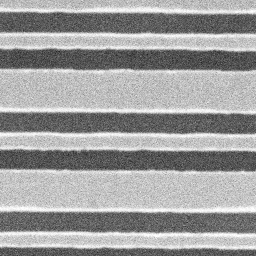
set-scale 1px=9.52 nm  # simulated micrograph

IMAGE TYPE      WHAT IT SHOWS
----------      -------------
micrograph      lines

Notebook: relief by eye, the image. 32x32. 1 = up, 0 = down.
11111111111111111111111111111111
00000000111001111011111111111111
00000000000000000000000000000000
00000000000000000000000000000000
11111111111111111111111111111111
11111111111111111111111111111111
00000000000000000000000000000000
00000000000000000000000000000000
00000000000000000000000000000000
11111111111111111111111111111111
11111111111111111111111111111111
11111111111111111111111111111111
11111111111111111111111111111111
11111111111111111111111111111111
00000000000000000000000000000000
00000000000000000000000000000000
00000000000000000000000000000000
11111111111111111111111111111111
11111111111111111111111111111111
00000000000000000000000000000000
00000000000000000000000000000000
11111111111111111111111110000010
11111111111111111111111111111111
11111111111111111111111111111111
11111111111111111111111111111111
11111111111111111111111111111111
00000000000000000000000000000000
00000000000000000000000000000000
00000000000000000000000000000000
11111111111111111111111111111111
11111111111111111111111111111111
00000000000000000000000000000000